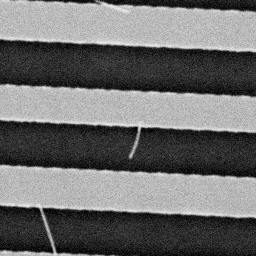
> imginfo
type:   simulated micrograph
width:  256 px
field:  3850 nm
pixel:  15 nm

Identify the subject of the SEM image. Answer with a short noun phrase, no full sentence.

lines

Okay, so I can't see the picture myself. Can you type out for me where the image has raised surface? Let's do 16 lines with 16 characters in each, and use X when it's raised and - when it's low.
XXXXXXXXXXX-----
XXXXXXXXXXXXXXXX
-XXXXXXXXXXXXXXX
----------------
----------------
XXXX------------
XXXXXXXXXXXXXXXX
-XXXXXXXXXXXXXXX
----------------
----------------
XXX-------------
XXXXXXXXXXXXXXXX
XXXXXXXXXXXXXXXX
--------------XX
----------------
----------------